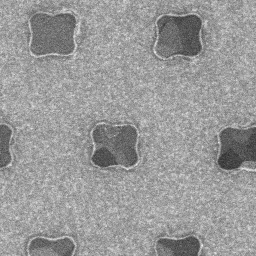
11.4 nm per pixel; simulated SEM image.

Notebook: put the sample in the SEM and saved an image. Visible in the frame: raised bodies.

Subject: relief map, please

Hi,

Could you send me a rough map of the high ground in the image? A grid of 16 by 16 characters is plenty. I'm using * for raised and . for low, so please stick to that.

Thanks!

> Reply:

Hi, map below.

................
..***.....***...
..***.....***...
..*.......**....
................
................
................
................
*.....***.....**
*.....***.....**
..............**
................
................
................
................
..***.....***...